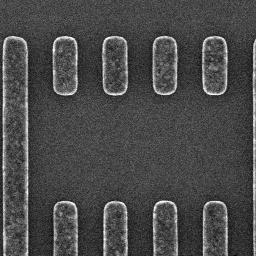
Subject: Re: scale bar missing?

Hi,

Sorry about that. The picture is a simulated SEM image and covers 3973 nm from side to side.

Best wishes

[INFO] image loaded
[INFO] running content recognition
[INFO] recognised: wiring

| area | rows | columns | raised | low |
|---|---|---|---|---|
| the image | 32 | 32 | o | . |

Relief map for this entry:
................................
................................
................................
................................
................................
.oo....ooo...ooo...ooo...ooo....
ooo....ooo...ooo...ooo...ooo....
ooo....ooo...ooo...ooo...ooo....
ooo....ooo...ooo...ooo...ooo....
ooo....ooo...ooo...ooo...ooo....
ooo....ooo...ooo...ooo...ooo....
ooo....oo....ooo....oo....oo....
ooo.............................
ooo.............................
ooo.............................
ooo.............................
ooo.............................
ooo.............................
ooo.............................
ooo.............................
ooo.............................
ooo.............................
ooo.............................
ooo.............................
ooo.............................
ooo....oo.....o.....oo....oo....
ooo....ooo...ooo...ooo...ooo....
ooo....ooo...ooo...ooo...ooo....
ooo....ooo...ooo...ooo...ooo....
ooo....ooo...ooo...ooo...ooo....
.oo....ooo...ooo...ooo...ooo....
.oo....ooo...ooo...ooo...ooo....